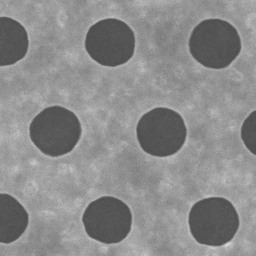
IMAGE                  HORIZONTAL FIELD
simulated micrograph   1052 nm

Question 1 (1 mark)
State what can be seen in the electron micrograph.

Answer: holes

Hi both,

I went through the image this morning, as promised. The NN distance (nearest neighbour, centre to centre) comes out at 424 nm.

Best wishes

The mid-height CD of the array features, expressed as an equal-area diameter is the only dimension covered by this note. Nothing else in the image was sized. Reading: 204 nm